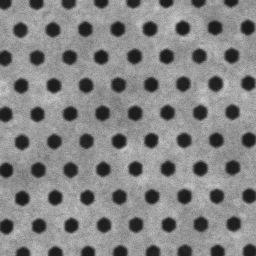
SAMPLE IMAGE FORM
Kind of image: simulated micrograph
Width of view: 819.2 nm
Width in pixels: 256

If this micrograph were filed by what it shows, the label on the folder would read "a regular array of holes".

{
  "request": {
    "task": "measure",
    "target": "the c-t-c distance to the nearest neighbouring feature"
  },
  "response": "0.102 µm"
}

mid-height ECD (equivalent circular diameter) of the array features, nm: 45.9